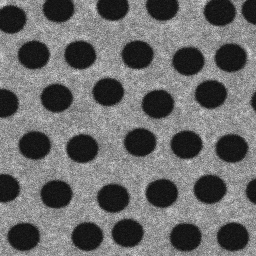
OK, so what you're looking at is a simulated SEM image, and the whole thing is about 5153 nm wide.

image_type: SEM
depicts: a regular array of holes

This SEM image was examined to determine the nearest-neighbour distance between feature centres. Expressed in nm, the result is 934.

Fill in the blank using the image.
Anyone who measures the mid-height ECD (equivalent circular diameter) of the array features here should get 622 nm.